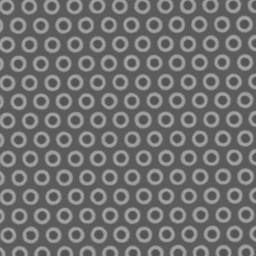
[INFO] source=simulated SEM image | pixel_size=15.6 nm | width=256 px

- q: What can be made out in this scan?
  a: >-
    a regular array of ring-shaped raised bodies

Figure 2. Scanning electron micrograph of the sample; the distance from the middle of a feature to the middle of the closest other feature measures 341 nm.